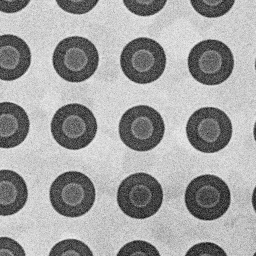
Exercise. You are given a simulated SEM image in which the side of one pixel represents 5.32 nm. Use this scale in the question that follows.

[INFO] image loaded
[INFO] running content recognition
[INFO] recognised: an array of small figures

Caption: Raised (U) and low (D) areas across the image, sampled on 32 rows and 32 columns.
DDDDUUUDDDDDUUUUDDDDDUUUDDDDDUUU
DDUUUUUUDDDUUUUUDDDDUUUUUDDDUUUU
UUUUUUUUUUUUUUUUUUUUUUUUUUUUUUUU
UUUUUUUUUUUUUUUUUUUUUUUUUUUUUUUU
DDUUUUUUUDUUUUUUUUUUUUUUUUUUUUUU
DDDUUUUDDDDDUUUUDDDDUUUUUDDDUUUU
DDDDUUUDDDDDUUUDDDDDDUUUDDDDDUUU
DDDDUUDDDDDDUUUDDDDDDUUDDDDDDUUU
DDDDUUUDDDDDUUUDDDDDDUUUDDDDDUUU
DDDUUUUDDDDUUUUUDDDDUUUUDDDDDUUU
UUUUUUUUUUUUUUUUUDUUUUUUUDDDUUUU
UUUUUUUUUUUUUUUUUUUUUUUUUUUUUUUU
UUUUUUUUUUUUUUUUUUUUUUUUUUUUUUUU
DDDUUUUDDDDUUUUUDDDUUUUUUDDUUUUU
DDDUUUUDDDDDUUUDDDDDUUUUDDDDUUUU
DDDDUUDDDDDDUUUDDDDDDUUDDDDDDUUU
DDDDUUDDDDDDUUUDDDDDDUUDDDDDDUUU
DDDUUUUDDDDDUUUDDDDDUUUDDDDDDUUU
DUUUUUUUDDDUUUUUDDDUUUUUDDDDUUUU
UUUUUUUUUUUUUUUUUUUUUUUUUUUUUUUU
UUUUUUUUUUUUUUUUUUUUUUUUUUDUUUUU
DDUUUUUUDDUUUUUUUUUUUUUUUUUUUUUU
DDDUUUUDDDDUUUUDDDDDUUUUDDDDUUUU
DDDUUUDDDDDDUUUDDDDDUUUDDDDDDUUU
DDDUUUDDDDDDUUUDDDDDUUUDDDDDDUUD
DDDUUUDDDDDDUUUDDDDDUUUDDDDDDUUD
DDUUUUUDDDDUDUUDDDDDUUUUDDDDUUUU
UUUUUUUUUUUUUUUUUUUUUUUUUDDUUUUU
UUUUUUUUUUUUUUUUUUUUUUUUUUUUUUUU
DUUUUUUUUUUUUUUUUUUUUUUUUUUUUUUU
DDDUUUUDDDDUUUUUDDDUUUUUDDDUUUUU
DDDUUUDDDDDUUUUDDDDDUUUDDDDDUUUU